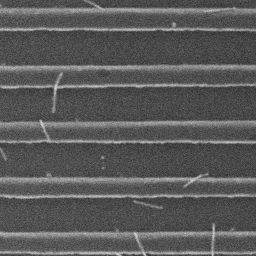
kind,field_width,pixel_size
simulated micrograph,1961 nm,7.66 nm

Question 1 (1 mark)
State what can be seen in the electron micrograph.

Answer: lines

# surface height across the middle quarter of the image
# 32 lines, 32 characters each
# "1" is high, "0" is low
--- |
00000000000000000000000000000000
11111111111111111111111111111111
11111111111111111111111111111111
11111111111111111111111111111111
11111111111111111111111111111111
11111111111111111111111101001111
00000000000000000000000000000000
00000000000000000000000000000000
00000000000000000000000000000000
00000000000000000000000000000000
00000000000000000000000000000000
00000000000000000000000000000000
00000000000000000000000000000000
00000000000000000000000000000000
00000000000000000000000000000000
11111111111111111111111111111111
11111111111111111111111111111111
11111111111111111111111111111111
11111111111111111111111111111111
00000000000001000001010010000000
00000000000000000000000000000000
00000000000000000000000000000000
00000000000000000000000000000000
00000000000000000000000000000000
00000000000000000000000000000000
00000000000000000000000000000000
00000000000000000000000000000000
00000000000000000000000000000000
00000000000000000000000000000000
11111111111111111111111111111111
11111111111111111111111111111111
11111111111111111111111111111111